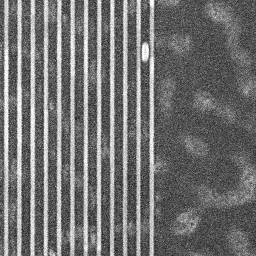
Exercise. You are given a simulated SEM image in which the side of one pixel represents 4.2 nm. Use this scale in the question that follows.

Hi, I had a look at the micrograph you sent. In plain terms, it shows parallel lines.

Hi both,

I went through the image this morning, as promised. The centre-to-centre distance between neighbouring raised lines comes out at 0.0556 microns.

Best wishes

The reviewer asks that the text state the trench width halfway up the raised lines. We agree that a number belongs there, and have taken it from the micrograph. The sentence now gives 42 nanometers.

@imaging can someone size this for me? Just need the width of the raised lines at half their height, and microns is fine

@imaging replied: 0.0142